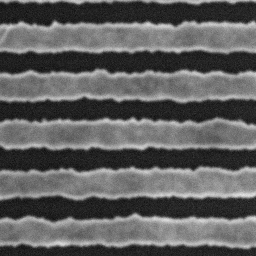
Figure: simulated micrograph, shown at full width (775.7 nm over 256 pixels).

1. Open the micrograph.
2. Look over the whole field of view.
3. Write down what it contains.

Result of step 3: lines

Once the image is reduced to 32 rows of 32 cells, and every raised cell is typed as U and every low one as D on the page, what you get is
DDDDDDDDDDDDDDDDDDDDDDDDDDDDDDDD
DDDDDDDDDDDDDDDDDDDDDDDDDDDDDDDD
DDDDDDDDDDDDDDDDDDDDDDDDDDDDDDDD
UUUUUUUUUUUUUUUUUUUUUUUUUUUUUUUU
UUUUUUUUUUUUUUUUUUUUUUUUUUUUUUUU
UUUUUUUUUUUUUUUUUUUUUUUUUUUUUUUU
DDUDDUUDDDDUUDDDUDDDDDDDDDDUUDDU
DDDDDDDDDDDDDDDDDDDDDDDDDDDDDDDD
DDDDDDDDDDDDDDDDDDDDDDDDDDDDDDDD
UUUUUUUUUUUUUUUUUUUUUUUUUUUUUUUU
UUUUUUUUUUUUUUUUUUUUUUUUUUUUUUUU
UUUUUUUUUUUUUUUUUUUUUUUUUUUUUUUU
UUUUUUUUDDDDDDUUDDUUDUUUUUDDDDDD
DDDDDDDDDDDDDDDDDDDDDDDDDDDDDDDD
DDDDDDDDDDDDDDDDDDDDDDDDDDDDDDDD
UUUUUUUUUUUUUUUUUUUUUUUUUUUUUUUD
UUUUUUUUUUUUUUUUUUUUUUUUUUUUUUUU
UUUUUUUUUUUUUUUUUUUUUUUUUUUUUUUU
UUUUDDUUUUUDUUUUUUDUUUUUUUUUUUUU
DDDDDDDDDDDDDDDDDDDDDDDDDDDDDDDD
DDDDDDDDDDDDDDDDDDDDDDDDDDDDDDDD
UUUUUUUUUUDUUUUUUUUUUUUUUUUUUUUU
UUUUUUUUUUUUUUUUUUUUUUUUUUUUUUUU
UUUUUUUUUUUUUUUUUUUUUUUUUUUUUUUU
UUUUUDDDUUUUUUUUUDUUUDUUUUUUUUUU
DDDDDDDDDDDDDDDDDDDDDDDDDDDDDDDD
DDDDDDDDDDDDDDDDDDDDDDDDDDDDDDDD
UUUUUUDDUUDUUUUUUUUUUUUUUUUUUUUU
UUUUUUUUUUUUUUUUUUUUUUUUUUUUUUUU
UUUUUUUUUUUUUUUUUUUUUUUUUUUUUUUU
UUUUUUUUUUUUUUUUUUUUUUUUUUUUUUUU
DDDDDDDDDDDDDDDDDDDDDDDDDDDDDDDD